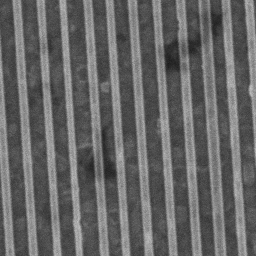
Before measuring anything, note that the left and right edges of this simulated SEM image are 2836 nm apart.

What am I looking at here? parallel lines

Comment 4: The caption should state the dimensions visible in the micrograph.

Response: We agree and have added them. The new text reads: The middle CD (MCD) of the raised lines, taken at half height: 0.0857 microns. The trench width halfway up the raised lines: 171 nanometers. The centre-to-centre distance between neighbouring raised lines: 0.257 micrometres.